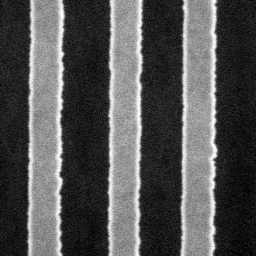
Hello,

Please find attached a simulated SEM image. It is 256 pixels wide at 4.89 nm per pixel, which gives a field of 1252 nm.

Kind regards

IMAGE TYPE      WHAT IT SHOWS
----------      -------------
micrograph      lines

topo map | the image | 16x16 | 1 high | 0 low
0011000110011000
0011000110011000
0011000110011000
0011000110011000
0011000110011000
0011000110011000
0011000110011000
0011000110011000
0011000110011000
0011000110011000
0011000110011000
0011000110011000
0011000110011000
0011000110011000
0011000110011000
0011000110011000